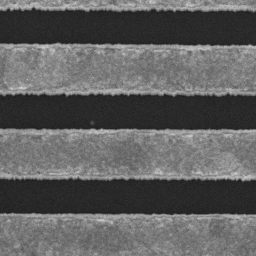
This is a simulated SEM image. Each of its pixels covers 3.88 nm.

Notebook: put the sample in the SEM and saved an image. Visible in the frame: lines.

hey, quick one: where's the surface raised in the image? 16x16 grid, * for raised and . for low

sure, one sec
****************
................
................
****************
****************
****************
................
................
****************
****************
****************
................
................
****************
****************
****************